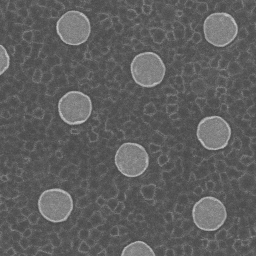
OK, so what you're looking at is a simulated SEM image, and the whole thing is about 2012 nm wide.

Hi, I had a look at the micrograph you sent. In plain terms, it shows a regular array of raised bodies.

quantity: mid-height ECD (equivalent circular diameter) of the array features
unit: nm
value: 264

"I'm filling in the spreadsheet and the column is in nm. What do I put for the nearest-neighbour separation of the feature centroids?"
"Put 637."